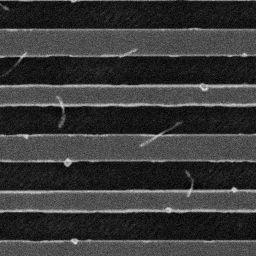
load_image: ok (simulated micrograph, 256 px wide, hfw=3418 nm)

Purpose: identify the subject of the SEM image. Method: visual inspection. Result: lines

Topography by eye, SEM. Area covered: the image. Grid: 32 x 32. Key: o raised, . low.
................................
................................
................................
................................
oooooooooooooooooooooooooooooooo
oooooooooooooooooooooooooooooooo
oooooooooooooooooooooooooooooooo
................................
................................
................................
................................
oooooooooooooooooooooooooooooooo
oooooooooooooooooooooooooooooooo
................................
................................
................................
................................
oooooooooooooooooooooooooooooooo
oooooooooooooooooooooooooooooooo
oooooooooooooooooooooooooooooooo
........o.......................
................................
................................
................................
oooooooooooooooooooooooooooooooo
oooooooooooooooooooooooooooooooo
o......ooooo.ooo....ooo.........
................................
................................
................................
oooooooooooooooooooooooooooooooo
oooooooooooooooooooooooooooooooo